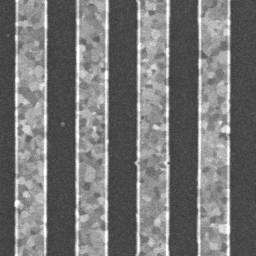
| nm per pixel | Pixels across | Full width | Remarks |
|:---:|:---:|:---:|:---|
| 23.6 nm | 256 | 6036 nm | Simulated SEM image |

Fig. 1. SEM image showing one or a few lines or trenches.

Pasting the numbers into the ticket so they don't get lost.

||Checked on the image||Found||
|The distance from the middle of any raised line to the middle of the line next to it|1440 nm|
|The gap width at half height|775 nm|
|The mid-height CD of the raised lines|671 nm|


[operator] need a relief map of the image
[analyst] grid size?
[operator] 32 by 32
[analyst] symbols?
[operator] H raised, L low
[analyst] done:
LLHHHHLLLLHHHLLLLHHHHLLLLHHHHLLL
LLHHHHLLLLHHHLLLLHHHHLLLLHHHHLLL
LLHHHHLLLLHHHLLLLHHHHLLLLHHHHLLL
LLHHHHLLLLHHHLLLLHHHHLLLLHHHHLLL
LLHHHHLLLLHHHLLLLHHHHLLLLHHHHLLL
LLHHHHLLLLHHHLLLLHHHHLLLLHHHHLLL
LLHHHHLLLLHHHLLLLHHHHLLLLHHHHLLL
LLHHHHLLLLHHHLLLLHHHHLLLLHHHHLLL
LLHHHHLLLLHHHLLLLHHHHLLLLHHHHLLL
LLHHHHLLLLHHHLLLLHHHHLLLLHHHHLLL
LLHHHHLLLLHHHLLLLHHHHLLLLHHHLLLL
LLHHHHLLLLHHHLLLLHHHHLLLLHHHLLLL
LLHHHHLLLLHHHLLLLHHHHLLLLHHHLLLL
LLHHHHLLLLHHHLLLLHHHHLLLLHHHLLLL
LLHHHHLLLLHHHLLLLHHHHLLLLHHHLLLL
LLHHHHLLLLHHHLLLLHHHHLLLLHHHLLLL
LLHHHHLLLLHHHLLLLHHHHLLLLHHHLLLL
LLHHHHLLLLHHHLLLLHHHHLLLLHHHLLLL
LLHHHHLLLLHHHLLLLHHHHLLLLHHHLLLL
LLHHHHLLLLHHHLLLLHHHHLLLLHHHLLLL
LLHHHHLLLLHHHLLLLHHHHLLLLHHHLLLL
LLHHHHLLLLHHHLLLLHHHHLLLLHHHLLLL
LLHHHHLLLLHHHLLLLHHHHLLLLHHHLLLL
LLHHHHLLLLHHHLLLLHHHHLLLLHHHLLLL
LLHHHHLLLLHHHLLLLHHHHLLLLHHHLLLL
LLHHHHLLLLHHHLLLLHHHHLLLLHHHLLLL
LLHHHHLLLLHHHLLLLHHHHLLLLHHHLLLL
LLHHHHLLLLHHHLLLLHHHHLLLLHHHLLLL
LLHHHHLLLLHHHLLLLHHHHLLLLHHHLLLL
LLHHHHLLLLHHHLLLLHHHHLLLLHHHLLLL
LLHHHHLLLLHHHLLLLHHHHLLLLHHHLLLL
LLHHHHLLLLHHHLLLLHHHHLLLLHHHLLLL